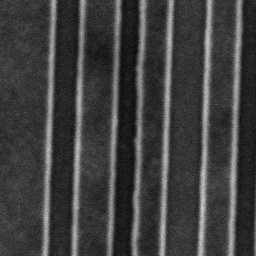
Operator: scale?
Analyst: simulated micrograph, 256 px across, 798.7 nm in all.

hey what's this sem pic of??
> one or a few lines or trenches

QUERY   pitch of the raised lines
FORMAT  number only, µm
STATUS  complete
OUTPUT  0.193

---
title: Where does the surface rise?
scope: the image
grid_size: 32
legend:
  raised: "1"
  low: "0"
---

11111110001111100011100000111100
11111110001111100011100000111100
11111110001111100011100000111100
11111110001111100011100000111100
11111110001111100011100000111100
11111110001111100011100000111100
11111110001111100011100000111100
11111110001111100111100000111100
11111110001111100111100000111100
11111100001111100111100000111100
11111100001111100111100000111100
11111100001111100111100000111100
11111100001111000111100000111100
11111100001111000111100000111100
11111100001111100111100000111100
11111100001111000111100000111100
11111100001111000111100000111100
11111100001111000111100000111000
11111100001111000111100000111000
11111100001111000111100001111000
11111100001111000111100001111000
11111100001111000111100001111000
11111100011111000111100001111000
11111100011111000111100001111000
11111100011111000111100001111000
11111100011111000111100001111000
11111100011111000111100001111000
11111100011111000111000001111000
11111100011111000111000001111000
11111100011111000111000001111000
11111100011111000111000001111000
11111100011111000111000001111000